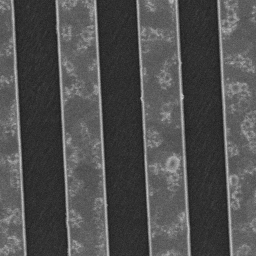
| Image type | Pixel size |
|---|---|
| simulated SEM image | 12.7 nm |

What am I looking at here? one or a few lines or trenches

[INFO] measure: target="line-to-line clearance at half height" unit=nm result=548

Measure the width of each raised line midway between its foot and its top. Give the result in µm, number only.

0.489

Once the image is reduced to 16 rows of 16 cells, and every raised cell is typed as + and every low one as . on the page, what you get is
+...++...++...++
+...++...++...++
+...++...++...++
+...++...++...++
+...++...++...++
+...++...++...++
+...++...++...++
+...++...++...++
+...++...++...++
+...++...+++..++
+...++...+++..++
+...++...+++..++
+...+++..+++..++
+...+++..+++..++
+...+++..+++..++
++..+++..+++..++